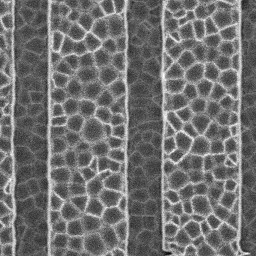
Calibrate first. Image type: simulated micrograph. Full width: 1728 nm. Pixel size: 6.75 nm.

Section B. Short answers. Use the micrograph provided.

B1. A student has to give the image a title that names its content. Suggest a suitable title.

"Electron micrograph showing one or a few lines or trenches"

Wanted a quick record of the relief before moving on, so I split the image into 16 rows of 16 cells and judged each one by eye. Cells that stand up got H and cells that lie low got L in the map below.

HLLHHHHHLLHHHHHL
HLLHHHHHLLHHHHHL
HLLHHHHHLLHHHHHL
HLLHHHHHLLHHHHHL
HLLHHHHHLLHHHHHL
HLLHHHHHLLHHHHHL
HLLHHHHHLLHHHHHL
HLLHHHHHLLHHHHHL
HLLHHHHHLLHHHHHL
HLLHHHHHLLHHHHHL
HLLHHHHHLLHHHHHL
HLLHHHHHLLHHHHHL
HLLHHHHHLLHHHHHL
HLLHHHHHLLHHHHHL
HLLHHHHHLLHHHHHL
HLLHHHHHLLHHHHHL